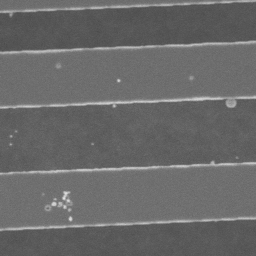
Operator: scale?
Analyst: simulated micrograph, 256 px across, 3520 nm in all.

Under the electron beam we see lines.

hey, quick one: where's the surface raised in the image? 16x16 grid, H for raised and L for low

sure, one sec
HHHHHHHLLLLLLLLL
LLLLLLLLLLLLLLLL
LLLLLLLLLLLLLLLL
HHHHHHHHHHHHHHHH
HHHHHHHHHHHHHHHH
HHHHHHHHHHHHHHHH
HHHHHHLLLLLLLLLL
LLLLLLLLLLLLLLLL
LLLLLLLLLLLLLLLL
LLLLLLLLLLLLLLLL
LLLLLLLHHHHHHHHH
HHHHHHHHHHHHHHHH
HHHHHHHHHHHHHHHH
HHHHHHHHHHHHHHHH
LLLLLLLLLLLLLLLL
LLLLLLLLLLLLLLLL